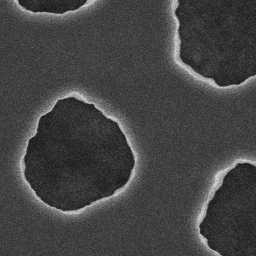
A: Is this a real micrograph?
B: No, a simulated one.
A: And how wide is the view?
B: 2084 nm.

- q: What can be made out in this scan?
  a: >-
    holes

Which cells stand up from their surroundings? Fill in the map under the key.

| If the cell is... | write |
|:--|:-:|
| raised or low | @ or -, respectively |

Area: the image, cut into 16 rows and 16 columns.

@@---@@@@@@-----
@@@@@@@@@@@-----
@@@@@@@@@@@-----
@@@@@@@@@@@-----
@@@@@@@@@@@@----
@@@@@@@@@@@@@@@@
@@@@--@@@@@@@@@@
@@@----@@@@@@@@@
@@------@@@@@@@@
@@------@@@@@@@@
@-------@@@@@@--
@@------@@@@@@--
@@@---@@@@@@@---
@@@@@@@@@@@@@---
@@@@@@@@@@@@@---
@@@@@@@@@@@@@---